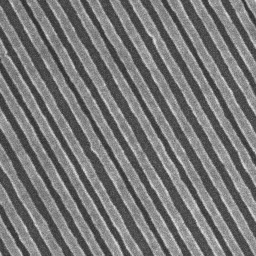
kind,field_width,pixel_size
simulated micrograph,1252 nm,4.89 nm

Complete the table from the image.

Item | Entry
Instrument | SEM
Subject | parallel lines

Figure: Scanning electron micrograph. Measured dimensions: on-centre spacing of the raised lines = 0.0857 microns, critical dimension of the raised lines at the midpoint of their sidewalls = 42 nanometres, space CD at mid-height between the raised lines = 42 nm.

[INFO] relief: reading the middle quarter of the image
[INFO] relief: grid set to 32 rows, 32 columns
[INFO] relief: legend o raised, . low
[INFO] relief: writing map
oo...ooo...oo..ooo...oo...oo...o
ooo...oo...ooo..oo...ooo..ooo..o
.oo...ooo...oo..ooo...oo...ooo..
..oo...oo...ooo..oo...ooo..ooo..
..ooo..ooo...oo...oo...ooo..ooo.
o..oo...oo...ooo..ooo...oo...oo.
oo.ooo...oo...ooo..oo...oo...ooo
oo..oo...ooo...oo..ooo...oo...oo
ooo..oo...oo...ooo..oo...ooo..oo
.oo..ooo..ooo...oo..ooo...oo...o
.ooo..oo...oo....oo..oo...ooo...
..oo..ooo..ooo...oo...oo...oo...
..ooo..oo...oo....oo..ooo...oo..
...ooo.ooo...oo...ooo..oo...oo..
o...oo..oo...ooo...oo..ooo...oo.
o...ooo..oo...oo...ooo..oo...ooo
oo...oo..ooo..ooo...oo..ooo...oo
oo...ooo..oo...oo....oo..oo...oo
ooo...oo..ooo..ooo...oo...oo...o
.oo....oo..oo...oo....oo..ooo...
..oo...ooo..oo...oo...ooo..oo...
..ooo..ooo..oo...ooo...oo..ooo..
...oo...ooo..oo...oo...ooo..oo..
o..ooo...oo..ooo..ooo...oo...oo.
o...oo...ooo..oo...oo....oo..oo.
oo..ooo...oo...oo..ooo...ooo..oo
ooo..oo....oo..oo...oo....oo..oo
.oo...oo...ooo.ooo...oo...ooo..o
.ooo..ooo...oo..ooo..ooo...oo..o
..oo...oo...ooo..oo...oo...ooo..
..ooo..ooo...oo..ooo..ooo...oo..
o..oo...oo....oo..oo...ooo..ooo.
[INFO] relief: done